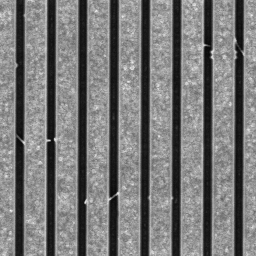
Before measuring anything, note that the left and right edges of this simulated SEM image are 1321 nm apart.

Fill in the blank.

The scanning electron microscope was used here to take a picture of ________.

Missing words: parallel lines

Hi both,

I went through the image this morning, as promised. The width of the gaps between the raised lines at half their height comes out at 43.9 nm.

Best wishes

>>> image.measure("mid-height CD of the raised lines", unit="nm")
119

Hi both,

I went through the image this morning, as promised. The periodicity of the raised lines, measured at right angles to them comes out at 162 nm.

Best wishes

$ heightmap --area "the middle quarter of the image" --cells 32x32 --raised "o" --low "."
ooo...ooooo...ooooo..oooooo..ooo
ooo...ooooo...ooooo..oooooo..ooo
ooo...ooooo...ooooo..oooooo..ooo
ooo...ooooo...ooooo..oooooo..ooo
ooo...ooooo...ooooo..oooooo..ooo
ooo...ooooo...ooooo..oooooo..ooo
ooo...ooooo...ooooo..oooooo..ooo
ooo...ooooo...ooooo..oooooo..ooo
ooo...ooooo...ooooo..oooooo..ooo
ooo...ooooo...ooooo..oooooo..ooo
ooo...ooooo...ooooo..oooooo..ooo
oooo..ooooo...ooooo..oooooo..ooo
ooo...ooooo...ooooo..oooooo..ooo
ooo...ooooo...ooooo..oooooo..ooo
ooo...ooooo...ooooo..oooooo..ooo
ooo...ooooo...ooooo..oooooo..ooo
ooo...ooooo...ooooo..oooooo..ooo
ooo...ooooo...ooooo..oooooo..ooo
ooo...ooooo...ooooo..oooooo..ooo
ooo...ooooo...ooooo..oooooo..ooo
ooo...ooooo...ooooo..oooooo..ooo
oooo..ooooo...ooooo..oooooo..ooo
ooo...ooooo...ooooo..oooooo..ooo
ooo...ooooo...ooooo..oooooo..ooo
ooo...ooooo...ooooo..oooooo..ooo
ooo...ooooo...ooooo..oooooo..ooo
ooo...ooooo...ooooo..oooooo..ooo
ooo...ooooo...ooooo..oooooo..ooo
ooo...ooooo...ooooo..oooooo..ooo
ooo...ooooo...ooooo..oooooo..ooo
ooo...ooooo...ooooo..oooooo..ooo
ooo...ooooo...ooooo..oooooo..ooo